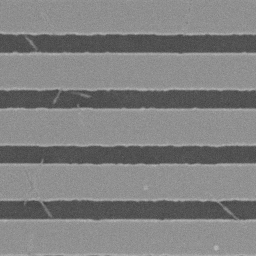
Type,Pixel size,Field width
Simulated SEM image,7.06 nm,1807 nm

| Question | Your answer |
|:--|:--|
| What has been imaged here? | lines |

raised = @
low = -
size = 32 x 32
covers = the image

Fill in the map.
@@@@@@@@@@@@@@@@@@@@@@@@@@@@@@@@
@@@@@@@@@@@@@@@@@@@@@@@@@@@@@@@@
@@@@@@@@@@@@@@@@@@@@@@@@@@@@@@@@
@@@@@@@@@@@@@@@@@@@@@@@@@@@@@@@@
--------------------------------
--------------------------------
--------------------------------
@@@@@@@@@@@@@@@@@@@@@@@@@@@@@@@@
@@@@@@@@@@@@@@@@@@@@@@@@@@@@@@@@
@@@@@@@@@@@@@@@@@@@@@@@@@@@@@@@@
@@@@@@@@@@@@@@@@@@@@@@@@@@@@@@@@
--------------------------------
--------------------------------
---------@----------------------
@@@@@@@@@@@@@@@@@@@@@@@@@@@@@@@@
@@@@@@@@@@@@@@@@@@@@@@@@@@@@@@@@
@@@@@@@@@@@@@@@@@@@@@@@@@@@@@@@@
@@@@@@@@@@@@@@@@@@@@@@@@@@@@@@@@
--------------------------------
--------------------------------
-----@--------------------------
@@@@@@@@@@@@@@@@@@@@@@@@@@@@@@@@
@@@@@@@@@@@@@@@@@@@@@@@@@@@@@@@@
@@@@@@@@@@@@@@@@@@@@@@@@@@@@@@@@
@@@@@@@@@@@@@@@@@@@@@@@@@@@@@@@@
--------------------------------
--------------------------------
@@@@@@@@@@@@-@@@@@-@-@@@@@@@@@-@
@@@@@@@@@@@@@@@@@@@@@@@@@@@@@@@@
@@@@@@@@@@@@@@@@@@@@@@@@@@@@@@@@
@@@@@@@@@@@@@@@@@@@@@@@@@@@@@@@@
@@@@@@@@@@@@@@@@@@@@@@@@@@@@@@@@